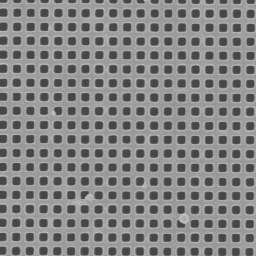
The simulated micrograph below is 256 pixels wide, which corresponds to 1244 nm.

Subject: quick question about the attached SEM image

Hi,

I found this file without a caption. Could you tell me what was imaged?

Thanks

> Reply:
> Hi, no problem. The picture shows a regular array of holes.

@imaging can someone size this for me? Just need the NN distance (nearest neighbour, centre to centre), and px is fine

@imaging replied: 13.6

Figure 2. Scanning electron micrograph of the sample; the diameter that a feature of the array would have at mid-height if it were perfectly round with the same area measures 44.5 nm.